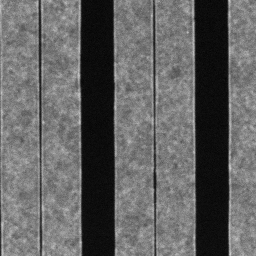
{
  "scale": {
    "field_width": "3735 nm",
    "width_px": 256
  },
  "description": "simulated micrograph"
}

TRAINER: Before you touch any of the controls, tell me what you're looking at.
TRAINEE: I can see wiring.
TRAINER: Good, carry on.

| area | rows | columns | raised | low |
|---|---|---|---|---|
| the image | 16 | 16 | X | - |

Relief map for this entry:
XXXXX--XXXXX--XX
XXXXX--XXXXX--XX
XXXXX--XXXXX--XX
XXXXX--XXXXX--XX
XXXXX--XXXXX--XX
XXXXX--XXXXX--XX
XXXXX--XXXXX--XX
XXXXX--XXXXX--XX
XXXXX--XXXXX--XX
XXXXX--XXXXX--XX
XXXXX--XXXXX--XX
XXXXX--XXXXX--XX
XXXXX--XXXXX--XX
XXXXX--XXXXX--XX
XXXXX--XXXXX--XX
XXXXX--XXXXX--XX